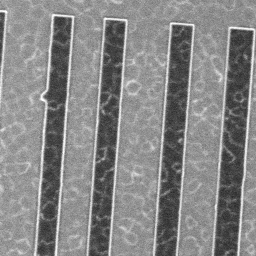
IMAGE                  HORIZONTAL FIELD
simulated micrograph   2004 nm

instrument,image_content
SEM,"one or a few lines or trenches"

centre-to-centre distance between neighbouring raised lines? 468 nanometres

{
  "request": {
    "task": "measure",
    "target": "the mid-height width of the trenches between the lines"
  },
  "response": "277 nanometres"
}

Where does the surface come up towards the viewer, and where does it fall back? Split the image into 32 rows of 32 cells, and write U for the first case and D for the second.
DDDDDDDDDDDDDDDDDDDDDDDDDDDDDDDD
DDDDDDDDDDDDDDDDDDDDDDDDDDDDDDDD
UDDDDDDUUDDDDUUUDDDDDDDDDDDDDDDD
UDDDDDUUUDDDDUUUDDDDDUUUDDDDDUDD
UDDDDDUUUDDDDUUUDDDDDUUUDDDDDUUU
DDDDDDUUUDDDDUUUDDDDDUUUDDDDDUUU
DDDDDDUUUDDDDUUUDDDDDUUUDDDDUUUU
DDDDDDUUUDDDDUUDDDDDDUUUDDDDUUUU
DDDDDDUUUDDDDUUDDDDDDUUUDDDDUUUD
DDDDDDUUUDDDDUUDDDDDDUUUDDDDUUUD
DDDDDDUUUDDDUUUDDDDDDUUUDDDDUUUD
DDDDDDUUDDDDUUUDDDDDDUUUDDDDUUUD
DDDDDUUUDDDDUUUDDDDDDUUUDDDDUUUD
DDDDDDUUDDDDUUUDDDDDDUUDDDDDUUUD
DDDDDDUUDDDDUUUDDDDDUUUDDDDDUUUD
DDDDDUUUDDDDUUUDDDDDUUUDDDDDUUUD
DDDDDUUUDDDDUUUDDDDDUUUDDDDDUUUD
DDDDDUUUDDDDUUUDDDDDUUUDDDDDUUUD
DDDDDUUUDDDDUUUDDDDDUUUDDDDDUUUD
DDDDDUUUDDDDUUUDDDDDUUUDDDDDUUUD
DDDDDUUUDDDDUUUDDDDDUUUDDDDUUUUD
DDDDDUUUDDDDUUDDDDDDUUUDDDDUUUUD
DDDDDUUUDDDDUUDDDDDDUUUDDDDUUUDD
DDDDDUUUDDDDUUDDDDDDUUUDDDDUUUDD
DDDDDUUUDDDUUUDDDDDDUUUDDDDUUUDD
DDDDDUUDDDDUUUDDDDDDUUUDDDDUUUDD
DDDDDUUDDDDUUUDDDDDDUUDDDDDUUUDD
DDDDDUUDDDDUUUDDDDDDUUDDDDDUUUDD
DDDDDUUDDDDUUUDDDDDUUUDDDDDUUUDD
DDDDDUUDDDDUUUDDDDDUUUDDDDDUUUDD
DDDDDUUDDDDUUUDDDDDUUUDDDDDUUUDD
DDDDUUUDDDDUUUDDDDDUUUDDDDDUUUDD